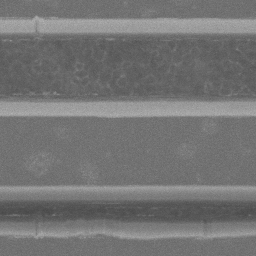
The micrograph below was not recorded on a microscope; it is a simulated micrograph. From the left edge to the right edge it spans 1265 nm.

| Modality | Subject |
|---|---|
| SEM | one or a few lines or trenches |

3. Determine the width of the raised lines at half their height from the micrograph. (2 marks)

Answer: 0.413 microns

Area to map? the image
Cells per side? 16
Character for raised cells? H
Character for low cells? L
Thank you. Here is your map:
HHHHHHHHHHHHHHHH
HHHHHHHHHHHHHHHH
LLLLLLLLLLLLLLLL
LLLLLLLLLLLLLLLL
LLLLLLLLLLLLLLLL
LLLLLLLLLLLLLLLL
LLLLLLLLLLLLLLLL
HHHHHHHHHHHHHHHH
HHHHHHHHHHHHHHHH
HHHHHHHHHHHHHHHH
HHHHHHHHHHHHHHHH
HHHHHHHHHHHHHHHH
LLLLLLLLLLLLLLLL
LLLLLLLLLLLLLLLL
HHHHHHHHHHHHHHHH
HHHHHHHHHHHHHHHH